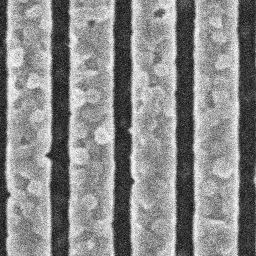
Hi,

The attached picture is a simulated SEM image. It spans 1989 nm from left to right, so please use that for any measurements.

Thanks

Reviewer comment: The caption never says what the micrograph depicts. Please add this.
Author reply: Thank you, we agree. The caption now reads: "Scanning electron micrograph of parallel lines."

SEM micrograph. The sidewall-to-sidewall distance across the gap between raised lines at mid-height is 161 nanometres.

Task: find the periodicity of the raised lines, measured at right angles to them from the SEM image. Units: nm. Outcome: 485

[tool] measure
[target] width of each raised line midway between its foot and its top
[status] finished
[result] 323 nm